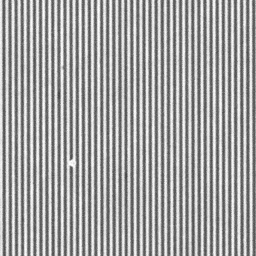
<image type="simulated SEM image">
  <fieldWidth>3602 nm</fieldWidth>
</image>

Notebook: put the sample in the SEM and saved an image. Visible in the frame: parallel lines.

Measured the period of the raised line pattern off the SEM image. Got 6.09 pixels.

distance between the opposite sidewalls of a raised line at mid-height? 28.1 nm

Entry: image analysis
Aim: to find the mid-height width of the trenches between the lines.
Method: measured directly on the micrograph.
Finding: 54.5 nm